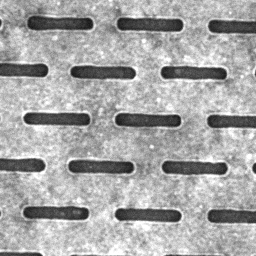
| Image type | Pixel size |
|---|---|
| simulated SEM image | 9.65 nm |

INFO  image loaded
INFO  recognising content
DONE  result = a regular array of holes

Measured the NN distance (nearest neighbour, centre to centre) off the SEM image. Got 624 nm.